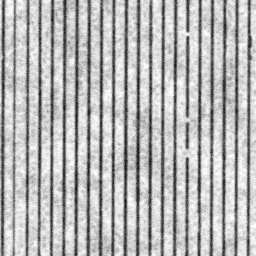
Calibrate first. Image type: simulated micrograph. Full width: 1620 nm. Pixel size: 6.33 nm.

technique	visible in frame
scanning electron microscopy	parallel lines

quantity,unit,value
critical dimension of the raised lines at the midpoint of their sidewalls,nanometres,52.2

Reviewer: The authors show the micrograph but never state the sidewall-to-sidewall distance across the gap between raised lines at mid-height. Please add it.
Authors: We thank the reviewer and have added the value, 24.5 nm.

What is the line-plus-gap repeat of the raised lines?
0.0778 um